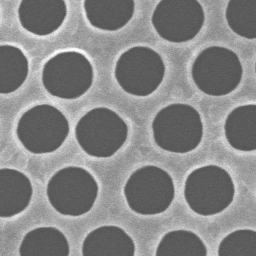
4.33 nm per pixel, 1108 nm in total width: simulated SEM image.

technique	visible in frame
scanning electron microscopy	a regular array of holes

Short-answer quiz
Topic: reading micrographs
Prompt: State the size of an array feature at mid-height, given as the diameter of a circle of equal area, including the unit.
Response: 0.216 micrometres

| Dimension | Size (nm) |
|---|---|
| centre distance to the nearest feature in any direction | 258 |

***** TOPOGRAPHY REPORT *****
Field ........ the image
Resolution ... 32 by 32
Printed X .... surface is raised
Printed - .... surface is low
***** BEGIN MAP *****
XXX-----XXX------XXX-----XXX----
XX------XXX------XX------XXX----
XX------XXX-----XXX-------XX----
XXX----XXXXX---XXXX------XXXX---
XXXXXXXXXXXXXXXXXXXX----XXXXXX--
XXXXXXXXXXXXXXXXXXXXXXXXXXXXXXXX
---XXXXX-XXXXXXX---XXXXXX----XXX
---XXX-----XXXX-----XXXX------XX
----X------XXX-------XXX------XX
---XX-------XX------XXXX------XX
---XX------XXXX-----XXXX------XX
-XXXXX-----XXXXX---XXXXXXX---XXX
XXXXXXXXXXXXXXXXXXXXXXXXXXXXXXXX
XXXX---XXXXX-XXXXXXXX---XXXXX---
XXX-----XX-----XXXX------XXX----
XX-------X------XXX------XXX----
XX--------------XXX------XXX----
XX------XX------XXX------XXX----
XXX----XXX-----XXXXX----XXXXX---
XXXXXXXXXXXX--XXXXXXXXXXXXXXXXXX
XXXXXXXXXXXXXXXXXXXXXXXXXXXXXXXX
--XXXXX----XXXXXX----XXX----XXXX
----XX------XXXX-----XX------XXX
----XX------XXXX------X------XXX
----XX------XXXX------X------XXX
----XX------XXXX-----XXX-----XXX
---XXXX----XXXXXX---XXXXX--XXXXX
XXXXXXXXXXXXXXXXXXXXXXXXXXXXXXXX
XXXXX--XXXXX---XXXXXXXXXXXXXXXXX
XXX-----XXX-----XXXXX----XXX----
XXX------X-------XXX-----XX-----
XX-------X-------XXX------X-----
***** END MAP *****